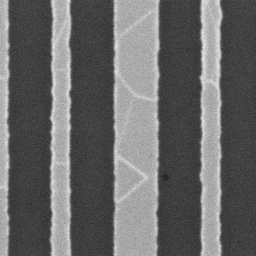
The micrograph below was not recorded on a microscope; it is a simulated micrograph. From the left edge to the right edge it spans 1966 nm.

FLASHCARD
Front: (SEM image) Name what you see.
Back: lines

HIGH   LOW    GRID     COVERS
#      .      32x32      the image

#......##.....######.....##.....
#......##.....######.....###....
#......##.....######.....###....
#......##.....######.....##.....
#......##.....######.....##.....
#......#......######.....##.....
#......##.....######.....###....
#......##.....######.....##.....
#......##.....######.....##.....
#......##.....######.....##.....
#......##.....######.....##.....
#......##.....######.....##.....
#......##.....######.....###....
#......##.....######.....##.....
#.....###.....######.....##.....
#......##.....######.....##.....
#......##.....######.....##.....
#......##.....######.....##.....
#.....###.....######.....##.....
#......##.....######.....###....
#......##.....######.....##.....
#.....###.....######.....##.....
#......##.....######.....##.....
#.....###.....######.....###....
#......##.....######.....###....
#.....###.....######.....##.....
#......##.....#####......##.....
#......##.....######.....##.....
#......##.....######.....##.....
#.....###.....######.....##.....
#.....###.....######.....##.....
#......##.....#####......###....